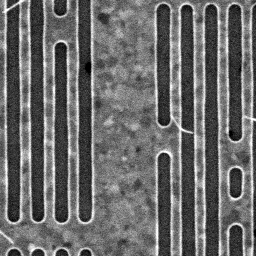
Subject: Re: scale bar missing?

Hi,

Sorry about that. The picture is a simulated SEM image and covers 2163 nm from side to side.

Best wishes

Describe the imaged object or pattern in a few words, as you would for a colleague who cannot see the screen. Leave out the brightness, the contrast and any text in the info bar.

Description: groups of lines, slits or small figures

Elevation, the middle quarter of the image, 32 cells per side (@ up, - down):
-@@@---@@@@@@@@@@@@@@@@----@@---
-@@----@@@@@@@@@@@@@@@@----@@---
-@@----@@@@@@@@@@@@@@@@----@@---
-@@----@@@@@@@@@@@@@@@@----@@---
-@@----@@@@@@@@@@@@@@@@----@@---
-@@----@@@@@@@@@@@@@@@@----@@---
-@@----@@@@@@@@@@@@@@@@----@@---
-@@----@@@@@@@@@@@@@@@@----@@---
-@@----@@@@@@@@@@@@@@@@----@@---
-@@----@@@@@@@@@@@@@@@@----@@---
-@@----@@@@@@@@@@@@@@@@----@@---
-@@----@@@@@@@@@@@@@@@@----@@---
-@@----@@@@@@@@@@@@@@@@----@@---
-@@@---@@@@@@@@@@@@@@@@----@@---
-@@@---@@@@@@@@@@@@@@@@----@@---
-@@@---@@@@@@@@@@@@@@@@@--@@@---
-@@----@@@@@@@@@@@@@@@@@@@@@@---
-@@----@@@@@@@@@@@@@@@@@@@@@@---
-@@----@@@@@@@@@@@@@@@@@@@@@@---
-@@----@@@@@@@@@@@@@@@@@@@@@@---
-@@----@@@@@@@@@@@@@@@@@@@@@@---
-@@----@@@@@@@@@@@@@@@@@@@@@@---
-@@@---@@@@@@@@@@@@@@@@@--@@@---
-@@@---@@@@@@@@@@@@@@@@----@@---
-@@----@@@@@@@@@@@@@@@@----@@---
-@@----@@@@@@@@@@@@@@@@----@@---
-@@----@@@@@@@@@@@@@@@@----@@---
-@@----@@@@@@@@@@@@@@@@----@@---
-@@----@@@@@@@@@@@@@@@@----@@---
-@@----@@@@@@@@@@@@@@@@----@@---
-@@----@@@@@@@@@@@@@@@@----@@---
-@@----@@@@@@@@@@@@@@@@----@@---